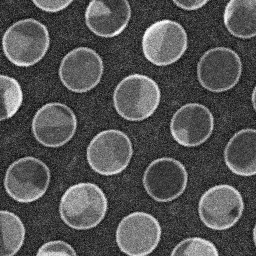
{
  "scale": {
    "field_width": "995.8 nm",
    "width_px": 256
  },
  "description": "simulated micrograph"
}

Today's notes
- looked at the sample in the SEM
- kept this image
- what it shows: a regular array of raised bodies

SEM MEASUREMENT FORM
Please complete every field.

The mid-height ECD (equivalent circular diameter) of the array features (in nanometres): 166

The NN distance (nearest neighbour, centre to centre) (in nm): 238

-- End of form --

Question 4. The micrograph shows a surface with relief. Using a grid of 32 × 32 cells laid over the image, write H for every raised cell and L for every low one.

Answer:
LLLLLHHHLLLHHHHHLLLLLLHHHLLLLHHH
LLLLLLLLLLLHHHHHLLLLLLLLLLLLHHHH
LLLLLLLLLLLHHHHHLLLLLLLLLLLLHHHH
LHHHHHLLLLLHHHHLLLLHHHHLLLLLLHHH
LHHHHHLLLLLLLLLLLLHHHHHLLLLLLLHL
LHHHHHLLLLLLLLLLLLHHHHHLLLLLLLLL
LHHHHHLLLHHHLLLLLLHHHHHLLLHHHLLL
LHHHHLLLHHHHLLLLLLLHHHLLLHHHHHLL
LLLLLLLLHHHHHLLLLLLLLLLLLHHHHHLL
LLLLLLLLHHHHHLLLLLLLLLLLLHHHHHLL
HHLLLLLLHHHHLLLHHHHLLLLLLHHHHLLL
HHHLLLLLLLLLLLHHHHHHLLLLLLLLLLLL
HHHLLLLLLLLLLLHHHHHHLLLLLLLLLLLL
HHLLLHHHLLLLLLLHHHHLLLLHHHLLLLLL
HLLLLHHHHLLLLLLHHHLLLLHHHHLLLLLL
LLLLHHHHHLLLLLLLLLLLLHHHHHLLLLLL
LLLLHHHHHLLLLHHLLLLLLLHHHHLLLLHH
LLLLLHHHLLLLHHHHLLLLLLHHHLLLLHHH
LLLLLLLLLLLHHHHHLLLLLLLLLLLLHHHH
LLLLLLLLLLLHHHHHLLLLLLLLLLLLHHHH
LLHHHLLLLLLHHHHHLLLHHHLLLLLLLHHH
LHHHHHLLLLLLHHHLLLHHHHHLLLLLLHHH
LHHHHHLLLLLLLLLLLLHHHHHLLLLLLLLL
LHHHHHLLLHHHLLLLLLHHHHHLLLLHHLLL
LLHHHLLLHHHHHLLLLLLHHHLLLLHHHHLL
LLLLLLLLHHHHHLLLLLLLLLLLLHHHHHLL
LLLLLLLLHHHHHLLLLLLLLLLLLHHHHHLL
HHLLLLLLHHHHLLLHHHHLLLLLLHHHHHLL
HHHLLLLLLLHLLLLHHHHHLLLLLLLHLLLL
HHHLLLLLLLLLLLLHHHHHLLLLLLLLLLLL
HHHLLLHHLLLLLLLHHHHHLLLHHHLLLLLL
HHLLLHHHHLLLLLLLHHHLLLHHHHHLLLLL